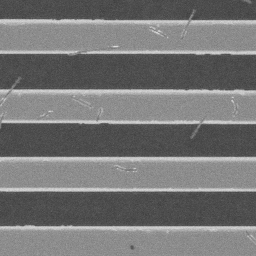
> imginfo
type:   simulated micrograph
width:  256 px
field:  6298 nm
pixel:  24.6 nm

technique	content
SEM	lines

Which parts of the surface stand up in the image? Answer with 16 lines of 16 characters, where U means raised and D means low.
DDDDDDDDDDDDDDDD
UUUUUUUUUUUUUUUU
UUUUUUUUUUUUUUUU
DDDDDDDDDDDDDDDD
DDDDDDDDDDDDDDDD
DDDDDDDDDDDDDDDD
UUUUUUUUUUUUUUUU
UUUUUUUUUUUUUUUU
DDDDDDDDDDDDDDDD
DDDDDDDDDDDDDDDD
UUUUUUUUUUUUUUUU
UUUUUUUUUUUUUUUU
DDDDDDDDDDDDDDDD
DDDDDDDDDDDDDDDD
UUUUUUUUUUUUUUUU
UUUUUUUUUUUUUUUU